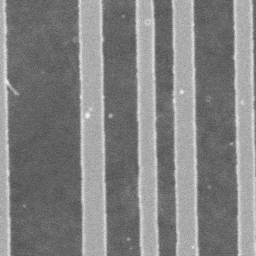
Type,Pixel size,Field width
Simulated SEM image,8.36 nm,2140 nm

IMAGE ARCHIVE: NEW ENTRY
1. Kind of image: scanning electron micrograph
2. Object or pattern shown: lines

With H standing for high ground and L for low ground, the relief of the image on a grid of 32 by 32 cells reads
HLLLLLLLLLHHHLLLLHHLLLHHLLLLLHHL
HLLLLLLLLLHHHLLLLHHLLLHHLLLLLHHL
HLLLLLLLLLHHHLLLLHHLLLHHLLLLLHHL
HLLLLLLLLLHHHLLLLHHLLLHHLLLLLHHL
HLLLLLLLLLHHHLLLLHHLLLHHLLLLLHHL
HLLLLLLLLLHHHLLLLHHLLLHHLLLLLHHH
HLLLLLLLLLHHHLLLLHHLLLHHLLLLLHHL
HLLLLLLLLLHHHLLLLHHLLLHHLLLLLHHH
HLLLLLLLLLHHHLLLLHHLLLHHLLLLLHHH
HLLLLLLLLLHHHLLLLHHLLLHHLLLLLHHH
HLLLLLLLLLHHHLLLLHHLLLHHLLLLLHHH
HLLLLLLLLLHHHLLLLHHLLLHHLLLLLLHH
HLLLLLLLLLHHHLLLLHHLLLHHLLLLLLHH
HLLLLLLLLLHHHLLLLHHLLLHHLLLLLLHH
HLLLLLLLLLHHHLLLLHHLLLHHLLLLLLHH
HLLLLLLLLLHHHLLLLHHLLLHHLLLLLLHH
HLLLLLLLLLHHHLLLLHHLLLHHLLLLLLHH
HLLLLLLLLLHHHLLLLHHLLLHHLLLLLLHH
HLLLLLLLLLHHHLLLLHHLLLHHLLLLLLHH
HLLLLLLLLLHHHLLLLHHLLLHHLLLLLLHH
HLLLLLLLLLHHHLLLLHHHLLHHHLLLLLHH
HLLLLLLLLLHHHLLLLHHHLLHHHLLLLLHH
HLLLLLLLLLHHHLLLLHHHLLHHHLLLLLHH
HLLLLLLLLLHHHLLLLHHHLLHHHLLLLLHH
HLLLLLLLLLHHHLLLLHHHLLHHHLLLLLHH
HLLLLLLLLLHHHLLLLHHHLLHHHLLLLLHH
HLLLLLLLLLHHHLLLLLHHLLHHHLLLLLHH
HLLLLLLLLLHHHLLLLLHHLLHHHLLLLLHH
HLLLLLLLLLHHHLLLLLHHLLHHHLLLLLHH
HLLLLLLLLLHHHLLLLLHHLLHHHLLLLLHH
HLLLLLLLLLHHHLLLLLHHLLHHHLLLLLHH
HLLLLLLLLLHHHLLLLLHHLLHHHLLLLLHH